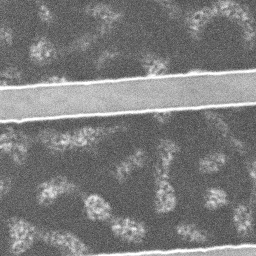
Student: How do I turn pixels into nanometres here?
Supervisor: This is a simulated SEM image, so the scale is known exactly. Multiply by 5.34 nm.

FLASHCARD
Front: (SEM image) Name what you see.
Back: one or a few lines or trenches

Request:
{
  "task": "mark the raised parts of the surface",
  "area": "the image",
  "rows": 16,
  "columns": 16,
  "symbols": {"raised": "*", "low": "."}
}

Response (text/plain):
****************
****************
****************
****************
***************.
................
...............*
.***************
****************
****************
****************
****************
****************
****************
*.**************
**************..